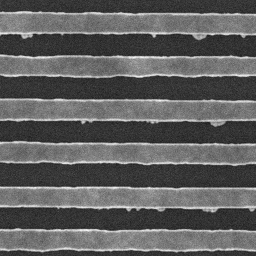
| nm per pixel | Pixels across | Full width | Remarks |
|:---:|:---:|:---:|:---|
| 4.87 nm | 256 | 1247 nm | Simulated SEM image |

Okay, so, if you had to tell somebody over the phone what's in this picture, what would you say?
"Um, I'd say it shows lines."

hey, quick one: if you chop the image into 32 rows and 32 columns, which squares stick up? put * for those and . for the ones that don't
................................
..****..........................
********************************
********************************
................................
................................
................................
********************************
********************************
****.**************..*******.**.
................................
................................
********........................
********************************
********************************
................................
................................
................................
********************************
********************************
..................*......******.
................................
................................
*****************...............
********************************
********************************
................................
................................
................................
********************************
********************************
................................